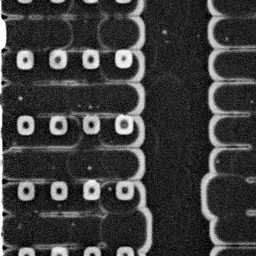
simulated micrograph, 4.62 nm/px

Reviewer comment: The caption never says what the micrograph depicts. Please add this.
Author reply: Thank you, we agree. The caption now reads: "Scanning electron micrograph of wiring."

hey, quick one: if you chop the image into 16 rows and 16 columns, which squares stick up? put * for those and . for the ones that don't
*********....***
*********....***
*********....***
*********....***
*********....***
*********....***
*********....***
*********....***
*********....***
*********....***
*********....***
*********....***
*********....***
*********....***
*********....***
*********....***